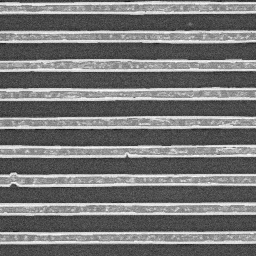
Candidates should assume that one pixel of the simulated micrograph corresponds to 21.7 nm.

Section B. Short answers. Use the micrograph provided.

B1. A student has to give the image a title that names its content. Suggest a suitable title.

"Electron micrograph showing parallel lines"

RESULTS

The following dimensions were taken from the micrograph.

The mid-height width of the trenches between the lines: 407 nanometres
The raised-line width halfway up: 220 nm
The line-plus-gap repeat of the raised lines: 623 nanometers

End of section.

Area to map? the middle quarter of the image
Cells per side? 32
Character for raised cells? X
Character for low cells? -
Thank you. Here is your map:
XXXXXXXXXXXXXXXXXXXXXXXXXXXXXXXX
------XXXXXXXXXXXXXXXXXXXXXXX---
--------------------------------
--------------------------------
--------------------------------
--------------------------------
--------------------------XXXXXX
XXXXXXXXXXXXXXXXXXXXXXXXXXXXXXXX
XXXXXXXXXXXXXXXXXXXXXXXXXXXXXXXX
--------------------------------
--------------------------------
--------------------------------
--------------------------------
----------------XXXXXXXXXX------
XXXXXXXXXXXXXXXXXXXXXXXXXXXXXXXX
XXXXXXXXXXXXXXXXXXXXXXXXXXXXXXXX
--------------------------------
--------------------------------
--------------------------------
--------------------------------
--------------------------------
XXXXXXXXXXXXXXXXXXXXXXXXXXXXXXXX
XXXXXXXXXXXXXXXXXXXXXXXXXXXXXXXX
--------------------------------
--------------------------------
--------------------------------
--------------------------------
--------------------------------
XXXXXXXXXXXXXXXXXXXXXXXXXXXXXXXX
XXXXXXXXXXXXXXXXXXXXXXXXXXXXXXXX
--------------------------------
--------------------------------